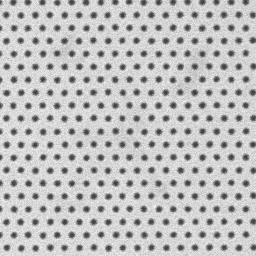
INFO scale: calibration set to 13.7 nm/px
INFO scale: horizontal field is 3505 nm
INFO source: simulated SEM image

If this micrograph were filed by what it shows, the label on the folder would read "a regular array of holes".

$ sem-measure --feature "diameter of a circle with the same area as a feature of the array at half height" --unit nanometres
100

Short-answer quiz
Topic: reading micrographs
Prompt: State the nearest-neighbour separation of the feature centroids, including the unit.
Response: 194 nm